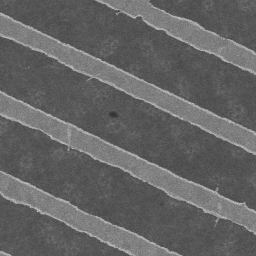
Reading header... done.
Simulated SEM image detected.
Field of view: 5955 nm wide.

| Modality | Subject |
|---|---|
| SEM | one or a few lines or trenches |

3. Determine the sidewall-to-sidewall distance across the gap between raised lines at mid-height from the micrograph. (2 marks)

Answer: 1240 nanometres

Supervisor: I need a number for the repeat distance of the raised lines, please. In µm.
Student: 1.67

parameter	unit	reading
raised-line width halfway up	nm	430